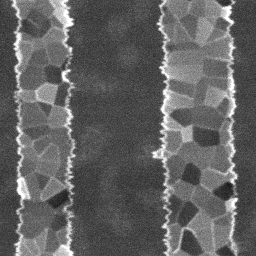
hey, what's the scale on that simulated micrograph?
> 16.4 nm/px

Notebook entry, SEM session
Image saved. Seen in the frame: one or a few lines or trenches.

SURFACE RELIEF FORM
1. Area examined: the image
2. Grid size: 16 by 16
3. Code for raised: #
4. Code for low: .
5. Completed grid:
.###......####..
.###......####..
.###......####..
.###......####..
.###......####..
.###......#####.
.###......#####.
.###......####..
.###......####..
.####.....#####.
.###......#####.
.###......#####.
.###......#####.
.###......#####.
.###......#####.
.###......#####.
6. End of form